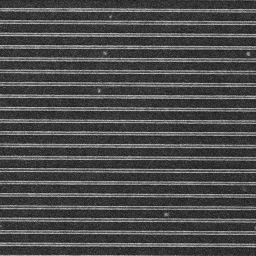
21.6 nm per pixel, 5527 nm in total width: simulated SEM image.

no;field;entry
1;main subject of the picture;parallel lines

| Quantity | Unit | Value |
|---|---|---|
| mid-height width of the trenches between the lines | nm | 200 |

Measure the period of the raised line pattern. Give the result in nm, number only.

267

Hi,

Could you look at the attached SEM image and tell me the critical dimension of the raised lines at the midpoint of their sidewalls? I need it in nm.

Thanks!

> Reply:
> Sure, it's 54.